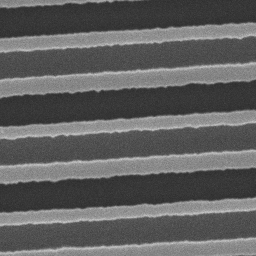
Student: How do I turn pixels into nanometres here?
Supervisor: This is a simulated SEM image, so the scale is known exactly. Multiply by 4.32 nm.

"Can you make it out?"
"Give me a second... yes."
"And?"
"lines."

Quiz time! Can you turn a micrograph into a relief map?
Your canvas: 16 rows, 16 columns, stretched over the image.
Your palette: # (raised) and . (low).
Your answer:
................
...............#
################
################
################
########........
................
.......#########
################
################
###############.
................
..............##
################
################
################